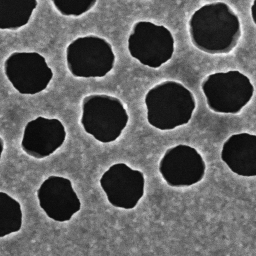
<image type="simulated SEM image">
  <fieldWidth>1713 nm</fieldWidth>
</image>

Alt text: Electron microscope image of a regular array of holes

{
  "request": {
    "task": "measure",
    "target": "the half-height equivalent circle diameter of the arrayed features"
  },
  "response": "299 nanometres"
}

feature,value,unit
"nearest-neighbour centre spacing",418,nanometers